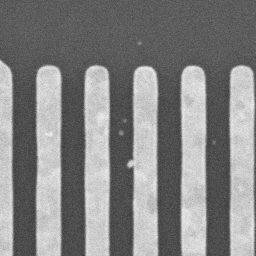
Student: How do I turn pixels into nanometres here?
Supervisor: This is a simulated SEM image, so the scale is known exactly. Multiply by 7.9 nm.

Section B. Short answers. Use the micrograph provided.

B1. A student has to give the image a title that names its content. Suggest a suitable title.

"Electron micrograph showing wiring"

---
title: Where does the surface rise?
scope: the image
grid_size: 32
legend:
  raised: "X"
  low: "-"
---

--------------------------------
--------------------------------
--------------------------------
--------------------------------
--------------------------------
--------------------------------
--------------------------------
--------------------------------
X----XX----XX-----X----XX-----X-
X----XXX---XX----XXX---XXX---XXX
X----XXX---XXX---XXX---XXX---XXX
X----XXX---XXX---XXX---XXX---XXX
X----XXX---XXX---XXX---XXX---XXX
X----XXX---XXX---XXX---XXX---XXX
X----XXX---XXX---XXX---XXX---XXX
X----XXX---XXX---XXX---XXX---XXX
X----XX----XXX---XXX---XXX---XXX
X----XX----XX----XXX---XXX---XXX
X----XX----XXX---XXX---XXX---XXX
X----XX----XXX---XXX---XXX---XXX
X----XX----XXX---XXX---XXX---XXX
X----XX----XXX---XXX---XXX---XXX
X----XX----XXX---XXX---XXX---XXX
X----XX----XXX---XXX---XXX---XXX
X----XX----XXX---XXX---XXX---XXX
X----XX----XXX---XXX---XXX---XXX
X----XX----XXX---XXX---XXX---XXX
X----XXX---XXX---XXX---XXX---XXX
X----XXX---XXX---XXX---XXX---XXX
X----XXX---XXX---XXX---XXX---XXX
X----XXX---XXX---XXX---XXX---XXX
X----XX----XXX---XXX---XXX---XXX